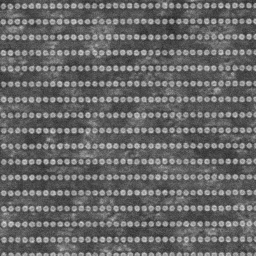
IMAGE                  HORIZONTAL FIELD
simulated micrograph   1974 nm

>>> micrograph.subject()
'a regular array of raised bodies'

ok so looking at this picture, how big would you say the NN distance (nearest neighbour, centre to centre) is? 53.2 nm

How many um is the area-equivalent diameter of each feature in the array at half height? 0.0359